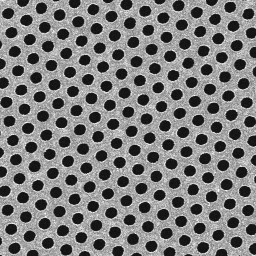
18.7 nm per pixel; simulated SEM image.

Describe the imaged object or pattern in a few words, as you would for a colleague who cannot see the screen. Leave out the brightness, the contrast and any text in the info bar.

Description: a regular array of holes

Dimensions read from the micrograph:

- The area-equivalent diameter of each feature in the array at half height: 219 nanometers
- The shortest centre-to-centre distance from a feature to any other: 360 nanometers